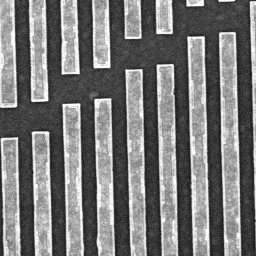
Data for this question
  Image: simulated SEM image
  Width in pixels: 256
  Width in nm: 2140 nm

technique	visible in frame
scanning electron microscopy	parallel lines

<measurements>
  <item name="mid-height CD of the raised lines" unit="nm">128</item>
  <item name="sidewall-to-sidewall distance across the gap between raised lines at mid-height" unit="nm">137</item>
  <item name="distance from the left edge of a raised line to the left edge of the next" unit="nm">263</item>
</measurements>